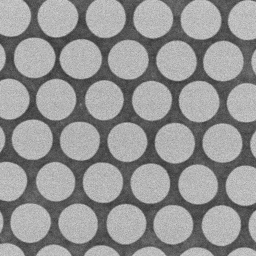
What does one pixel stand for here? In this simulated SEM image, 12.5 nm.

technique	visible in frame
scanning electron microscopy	an array of small figures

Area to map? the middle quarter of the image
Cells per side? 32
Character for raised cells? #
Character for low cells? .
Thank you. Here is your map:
#########..##########..#########
#########...########....########
.#######.....#######.....#######
...###........####........#####.
........####.........##.........
##.....######......######.....##
##....########....########....##
###...#########..##########..###
###..##########..##########..###
###..##########..##########..###
###...#########..##########..###
##....########....########...###
#......######.....########....##
........####........####.......#
................................
.######......######......#####..
########....########....#######.
#########..#########...#########
#########..##########..#########
#########..##########..#########
#########..##########..#########
########...#########...#########
.#######....########....########
..####.......#####......#######.
..........................###...
.......#####.......#####........
##....########....#######.....##
##...#########...#########...###
###..#########...#########...###
###..#########...#########...###
###..#########...#########...###
##...#########...#########...###